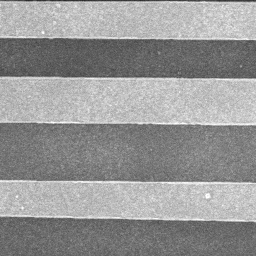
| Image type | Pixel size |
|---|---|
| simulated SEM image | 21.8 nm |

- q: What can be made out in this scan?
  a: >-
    lines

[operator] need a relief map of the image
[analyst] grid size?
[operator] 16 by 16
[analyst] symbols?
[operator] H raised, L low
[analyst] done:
HHHHHHHHHHHHHHHH
HHHHHHHHHHHHHHHH
LLLLLLLLLLLLLLLL
LLLLLLLLLLLLLLLL
LLLLLLLLLLLLLLLL
HHHHHHHHHHHHHHHH
HHHHHHHHHHHHHHHH
HHHHHHHHHHHHHHHH
LLLLLLLLLLLLLLLL
LLLLLLLLLLLLLLLL
LLLLLLLLLLLLLLLL
HHHHHHHHHHHHHHHH
HHHHHHHHHHHHHHHH
LHHHHHHHHHHHHHHH
LLLLLLLLLLLLLLLL
LLLLLLLLLLLLLLLL